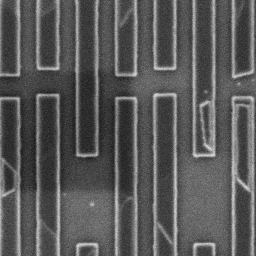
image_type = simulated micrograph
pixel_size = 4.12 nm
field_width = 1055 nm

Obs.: wiring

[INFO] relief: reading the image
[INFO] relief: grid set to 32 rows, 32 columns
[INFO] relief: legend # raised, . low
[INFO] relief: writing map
##...##...##...##..###..###..###
##...##...##...##..###..###..###
##...##...##...##..###..###..###
##...##...##...##..###..###..###
##...##...##...##..###..###..###
##...##...##...##..###..###..###
##...##...##...##..###..###..###
##...##...##...##..###..###..###
##...##...##...##...##..###..###
..........##............###..#..
..........##............###.....
..........##............###.....
##...##...##...##..###..###..###
##...##...##...##..###..###..###
##...##...##...##..###..###..###
##...##...##...##..###..###..###
##...##...##...##..###..###..###
##...##...##...##..###..###..###
##...##...##...##..###..###..###
##...##...#....##..###.......###
##...##........##..###.......###
##...##........##..###.......###
##...##........##..###.......###
##...##........##..###.......###
##...##........##..###.......###
##...##........##..###.......###
##...##........##..###.......###
##...##........##..###.......###
##...##........##..###.......###
##...##........##..###.......###
##...##...##...##..###..###..###
##...##...##...##..###..###..###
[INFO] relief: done